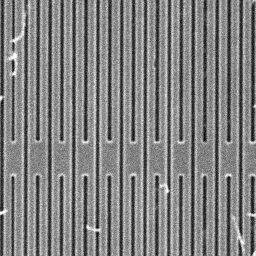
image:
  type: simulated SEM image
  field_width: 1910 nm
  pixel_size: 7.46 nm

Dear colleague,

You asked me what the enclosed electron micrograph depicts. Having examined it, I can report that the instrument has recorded parallel lines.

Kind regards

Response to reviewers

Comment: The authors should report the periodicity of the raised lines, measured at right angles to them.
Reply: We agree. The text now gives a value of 89 nm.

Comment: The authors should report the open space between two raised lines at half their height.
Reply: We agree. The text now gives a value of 28.9 nanometres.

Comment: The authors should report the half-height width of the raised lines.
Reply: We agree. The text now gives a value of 7.63 pixels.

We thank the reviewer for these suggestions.